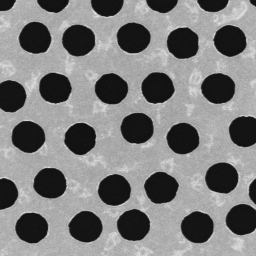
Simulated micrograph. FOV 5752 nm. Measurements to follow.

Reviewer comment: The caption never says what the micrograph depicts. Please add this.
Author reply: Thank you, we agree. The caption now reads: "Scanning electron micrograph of a regular array of holes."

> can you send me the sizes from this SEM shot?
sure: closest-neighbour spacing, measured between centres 1060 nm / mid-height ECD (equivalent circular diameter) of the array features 722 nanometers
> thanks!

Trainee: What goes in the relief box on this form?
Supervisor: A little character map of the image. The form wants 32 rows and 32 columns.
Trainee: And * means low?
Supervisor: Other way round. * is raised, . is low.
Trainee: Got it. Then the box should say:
..***...***....***....***...****
******.*****...*****.***********
********************************
***...***..****...****..****..**
**....**....***....**....**....*
**....**....***....**....**....*
****..***..*****..***....**...**
********************************
********************************
******..*****..***...*****..****
..***....***....**....***....***
...**....***....**....***....***
...***..*****..***...*****...***
...*****************************
****************..**************
**...****..****....***.******...
**....**....***....**....****...
*.....**....****..***....****...
**...****...*********....*******
********************************
***************************..***
*****...******************....**
.***....*****...**....****....**
..**....****....**....****...**.
..***...****....**....*********.
..***********..*****************
**********.*****..******.****...
**....***....**....****...**....
**....***....**....****....**...
**....***...***...*****...******
********************************
********************************